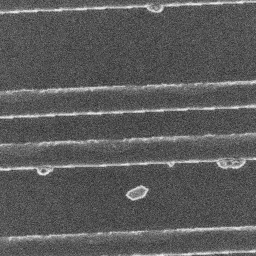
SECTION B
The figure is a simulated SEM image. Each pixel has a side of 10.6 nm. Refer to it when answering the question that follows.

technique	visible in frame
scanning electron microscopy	lines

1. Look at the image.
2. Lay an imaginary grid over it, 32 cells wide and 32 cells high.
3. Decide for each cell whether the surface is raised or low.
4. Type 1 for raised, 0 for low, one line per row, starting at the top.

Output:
11111111111111111111111100000000
11000000000000000000000000000000
00000000000000000000000000000000
00000000000000000000000000000000
00000000000000000000000000000000
00000000000000000000000000000000
00000000000000000000000000000000
00000000000000000000000000000000
00000000000000000000000000000000
00000000000000000000000000000000
00000000000000000000000000011111
00000111111111111111111111111111
11111111111111111111111111111111
11111111111111111111111111000000
11100000000000000000000000000000
00000000000000000000000000000000
00000000000000000000000000000000
00000000000000000011111111111111
11111111111111111111111111111111
11111111111111111111111111111111
11111111111111110000000000001100
00000100000000000000000000000000
00000000000000000000000000000000
00000000000000000000000000000000
00000000000000000000000000000000
00000000000000000000000000000000
00000000000000000000000000000000
00000000000000000000000000000000
00000000000000000000000000000000
00000000000011111111111111111111
11111111111111111111111111111111
11111111111111111111111111110000